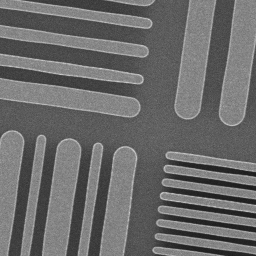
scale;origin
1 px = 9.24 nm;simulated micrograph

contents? groups of lines, slits or small figures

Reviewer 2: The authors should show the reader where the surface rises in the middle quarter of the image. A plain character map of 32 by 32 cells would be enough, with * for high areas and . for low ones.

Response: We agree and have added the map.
*****........................***
***********..................***
******************...........***
......**************.........***
...............*****.........***
............................****
*****.......................****
***********.................****
******************..........****
*******************.........****
*******************.........****
....***************.........****
............******..........****
..............................**
................................
................................
................................
................................
................................
***.............................
****...***......................
****...***...****...............
****...**....*****........*****.
****...**...******........******
****...**...******.............*
****...**...******.......***....
****...**...******.......*******
***...***...******...........***
***...***...*****...............
***...***..******........******.
***...**...******........*******
***...**...******...............